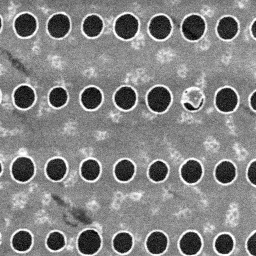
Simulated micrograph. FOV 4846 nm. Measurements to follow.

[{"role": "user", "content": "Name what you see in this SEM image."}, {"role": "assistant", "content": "a regular array of holes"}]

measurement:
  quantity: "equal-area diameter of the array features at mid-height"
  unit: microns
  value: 0.441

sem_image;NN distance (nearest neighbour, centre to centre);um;0.638